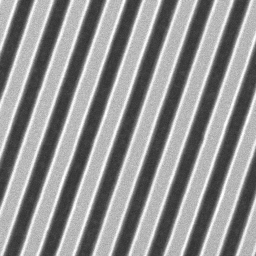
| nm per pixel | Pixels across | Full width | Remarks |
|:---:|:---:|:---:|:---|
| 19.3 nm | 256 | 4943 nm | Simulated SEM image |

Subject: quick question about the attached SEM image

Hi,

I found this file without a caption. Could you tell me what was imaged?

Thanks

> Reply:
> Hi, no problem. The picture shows parallel lines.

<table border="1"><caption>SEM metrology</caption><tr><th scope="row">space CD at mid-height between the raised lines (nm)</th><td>283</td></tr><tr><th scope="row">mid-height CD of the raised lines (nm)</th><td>370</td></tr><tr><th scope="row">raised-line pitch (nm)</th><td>658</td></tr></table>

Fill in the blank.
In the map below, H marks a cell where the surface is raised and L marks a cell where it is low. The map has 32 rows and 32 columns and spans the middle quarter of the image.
HLLLLHHHHHLLLLHHHHHLLLLHHHHHLLLL
HLLLLHHHHHLLLLHHHHHLLLHHHHHHLLLH
LLLLHHHHHLLLLHHHHHLLLLHHHHHLLLLH
LLLLHHHHHLLLLHHHHHLLLLHHHHHLLLLH
LLLLHHHHHLLLLHHHHHLLLHHHHHHLLLHH
LLLHHHHHLLLLHHHHHLLLLHHHHHLLLLHH
LLLHHHHHLLLLHHHHHLLLLHHHHHLLLLHH
LLHHHHHHLLLLHHHHHLLLHHHHHHLLLHHH
LLHHHHHLLLLHHHHHLLLLHHHHHLLLLHHH
LLHHHHHLLLLHHHHHLLLLHHHHHLLLLHHH
LLHHHHHLLLHHHHHHLLLHHHHHHLLLHHHH
LHHHHHLLLLHHHHHLLLLHHHHHLLLLHHHH
LHHHHHLLLLHHHHHLLLLHHHHHLLLLHHHH
LHHHHHLLLHHHHHHLLLHHHHHHLLLHHHHH
HHHHHLLLLHHHHHLLLLHHHHHLLLLHHHHH
HHHHHLLLLHHHHHLLLLHHHHHLLLLHHHHH
HHHHHLLLHHHHHLLLLHHHHHHLLLLHHHHH
HHHHLLLLHHHHHLLLLHHHHHLLLLHHHHHL
HHHHLLLLHHHHHLLLLHHHHHLLLLHHHHHL
HHHHLLLHHHHHLLLLHHHHHHLLLLHHHHHL
HHHLLLLHHHHHLLLLHHHHHLLLLHHHHHLL
HHHLLLLHHHHHLLLLHHHHHLLLLHHHHHLL
HHHLLLHHHHHLLLLHHHHHHLLLLHHHHHLL
HHLLLLHHHHHLLLLHHHHHLLLLHHHHHLLL
HHLLLLHHHHHLLLLHHHHHLLLLHHHHHLLL
HHLLLHHHHHLLLLHHHHHHLLLHHHHHHLLL
HLLLLHHHHHLLLLHHHHHLLLLHHHHHLLLL
HLLLLHHHHHLLLLHHHHHLLLLHHHHHLLLL
LLLLHHHHHLLLLHHHHHHLLLHHHHHHLLLH
LLLLHHHHHLLLLHHHHHLLLLHHHHHLLLLH
LLLLHHHHHLLLLHHHHHLLLLHHHHHLLLLH
LLLHHHHHLLLLHHHHHHLLLHHHHHHLLLHH